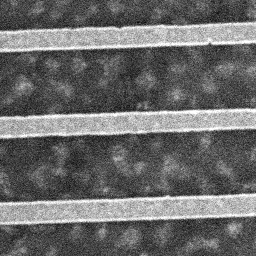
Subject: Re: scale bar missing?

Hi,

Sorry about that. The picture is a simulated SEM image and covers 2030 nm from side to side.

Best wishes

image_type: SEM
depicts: one or a few lines or trenches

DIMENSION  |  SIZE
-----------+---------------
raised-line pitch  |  86.2 pixels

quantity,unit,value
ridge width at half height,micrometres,0.151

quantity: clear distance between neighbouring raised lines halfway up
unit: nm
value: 533